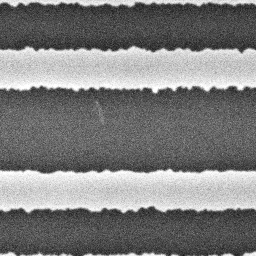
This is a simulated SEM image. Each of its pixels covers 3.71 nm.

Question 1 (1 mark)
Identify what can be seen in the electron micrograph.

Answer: lines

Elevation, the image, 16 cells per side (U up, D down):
DDDDDDDDDDDDDDDD
DDDDDDDDDDDDDDDD
DDDDDDDDDDDDDDDD
UUUUUUUUUUUUUUUU
UUUUUUUUUUUUUUUU
DDDDDUDUUDDDDDDD
DDDDDDDDDDDDDDDD
DDDDDDDDDDDDDDDD
DDDDDDDDDDDDDDDD
DDDDDDDDDDDDDDDD
DDDDDDDDDDDDDDDD
UUUUUUUUUUUUUUUU
UUUUUUUUUUUUUUUU
DDDDDDDDDDDDDDDD
DDDDDDDDDDDDDDDD
DDDDDDDDDDDDDDDD